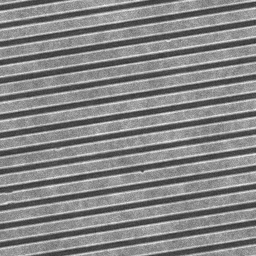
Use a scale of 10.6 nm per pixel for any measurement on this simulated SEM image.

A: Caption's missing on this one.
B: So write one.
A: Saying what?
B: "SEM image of parallel lines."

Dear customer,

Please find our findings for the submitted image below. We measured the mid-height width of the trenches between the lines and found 72.1 nm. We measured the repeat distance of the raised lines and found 191 nm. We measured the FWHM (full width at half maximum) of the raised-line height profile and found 118 nm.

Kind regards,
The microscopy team